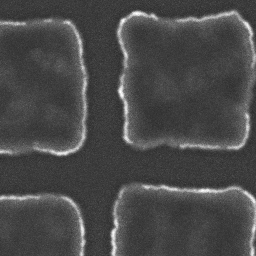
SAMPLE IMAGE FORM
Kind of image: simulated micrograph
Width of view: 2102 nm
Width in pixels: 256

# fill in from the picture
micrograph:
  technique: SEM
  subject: raised bodies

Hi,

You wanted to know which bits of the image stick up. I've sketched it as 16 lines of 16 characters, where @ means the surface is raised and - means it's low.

----------------
@@@@----@@@@@@@-
@@@@@---@@@@@@@@
@@@@@---@@@@@@@@
@@@@@---@@@@@@@@
@@@@@---@@@@@@@@
@@@@@---@@@@@@@-
@@@@@---@@@@@@@@
@@@@@---@@@@@@@-
@--@------------
----------------
----------------
@@@@---@@@@@@@@@
@@@@@--@@@@@@@@@
@@@@@--@@@@@@@@@
@@@@@--@@@@@@@@@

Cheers